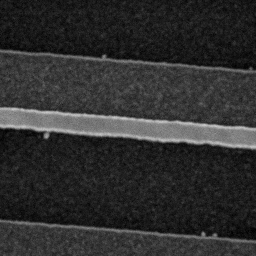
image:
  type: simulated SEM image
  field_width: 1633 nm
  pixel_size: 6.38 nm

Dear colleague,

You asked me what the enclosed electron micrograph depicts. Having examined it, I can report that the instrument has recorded lines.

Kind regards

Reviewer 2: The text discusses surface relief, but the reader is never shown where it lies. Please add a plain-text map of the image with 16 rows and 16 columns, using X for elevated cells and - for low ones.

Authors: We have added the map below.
----------------
----------------
----------------
XXXX------------
XXXXXXXXXXXXXXXX
XXXXXXXXXXXXXXXX
XXXXXXXXXXXXXXXX
XXXXXXXXXXXXXXXX
--------XXXXXXXX
----------------
----------------
----------------
----------------
----------------
XXXXXXXX--------
XXXXXXXXXXXXXXXX